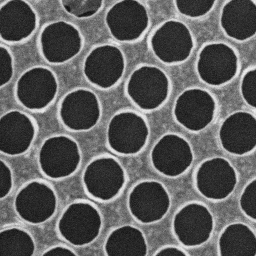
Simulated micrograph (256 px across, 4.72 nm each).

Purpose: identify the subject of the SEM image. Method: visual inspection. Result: a regular array of holes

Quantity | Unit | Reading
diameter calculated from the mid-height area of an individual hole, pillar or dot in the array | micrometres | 0.196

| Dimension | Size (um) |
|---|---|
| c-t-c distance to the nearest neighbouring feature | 0.234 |